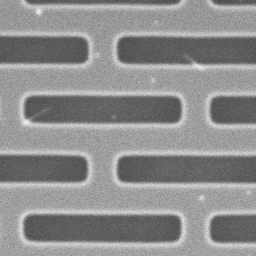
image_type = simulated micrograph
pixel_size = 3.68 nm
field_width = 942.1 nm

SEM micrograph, groups of lines, slits or small figures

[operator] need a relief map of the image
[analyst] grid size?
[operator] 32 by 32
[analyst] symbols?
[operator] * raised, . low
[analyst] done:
****..................*****.....
********************************
********************************
********************************
.........*******......**********
...........****.................
...........***..................
...........****.................
********************************
********************************
********************************
********************************
***....................***......
***....................***......
***....................***......
***********.......**.******.....
********************************
********************************
********************************
..........*****.................
...........****.................
...........***..................
...........****.................
********************************
********************************
********************************
********************************
***....................***......
***....................***......
***....................***......
******************.*********....
********************************